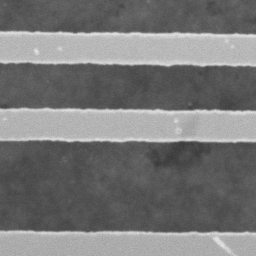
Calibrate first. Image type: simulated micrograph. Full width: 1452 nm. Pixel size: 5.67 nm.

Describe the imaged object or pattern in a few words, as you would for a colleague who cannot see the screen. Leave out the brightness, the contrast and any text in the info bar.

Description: lines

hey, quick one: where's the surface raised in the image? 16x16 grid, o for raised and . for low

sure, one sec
................
................
oooooooooooooooo
oooooooooooooooo
................
................
................
oooooooooooooooo
oooooooooooooooo
................
................
................
................
................
oo..............
oooooooooooooooo